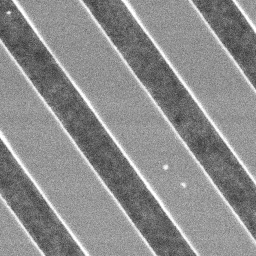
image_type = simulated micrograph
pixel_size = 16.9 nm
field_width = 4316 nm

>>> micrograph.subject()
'lines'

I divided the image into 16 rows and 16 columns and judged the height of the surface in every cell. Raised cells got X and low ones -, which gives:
-XXXX---XXXX---X
--XXXX---XXXX---
---XXXX--XXXXX--
X--XXXXX--XXXX--
X---XXXX---XXXX-
XX---XXXX---XXXX
XXX--XXXXX--XXXX
XXXX--XXXXX--XXX
XXXX---XXXX---XX
-XXXX---XXXX---X
-XXXXX--XXXXX--X
--XXXXX--XXXX---
---XXXX---XXXX--
X---XXXX---XXXX-
XX--XXXXX--XXXXX
XX---XXXX---XXXX